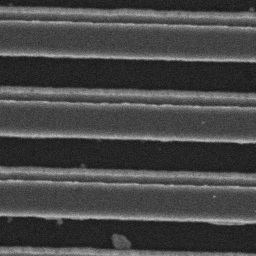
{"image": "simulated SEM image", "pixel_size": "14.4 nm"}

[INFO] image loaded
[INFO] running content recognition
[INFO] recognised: lines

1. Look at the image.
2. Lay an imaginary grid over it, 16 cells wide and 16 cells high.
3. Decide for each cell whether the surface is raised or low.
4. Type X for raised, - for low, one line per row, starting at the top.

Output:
----------------
XXXXXXXXXXXXXXXX
XXXXXXXXXXXXXXXX
--XXXXXXXXXXXXXX
----------------
----------------
XXXXXXXXXXXXXXXX
XXXXXXXXXXXXXXXX
-XXXXXXXXXXXXXXX
----------------
----------------
XXXXXXXXXXXXXXXX
XXXXXXXXXXXXXXXX
-XXXXXXXXXXXXXXX
----------------
----------------